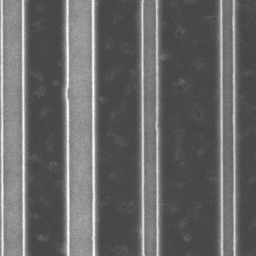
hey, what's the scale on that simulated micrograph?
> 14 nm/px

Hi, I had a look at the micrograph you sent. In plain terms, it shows one or a few lines or trenches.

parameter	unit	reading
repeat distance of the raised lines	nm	1010